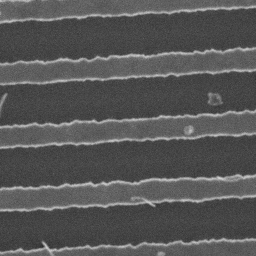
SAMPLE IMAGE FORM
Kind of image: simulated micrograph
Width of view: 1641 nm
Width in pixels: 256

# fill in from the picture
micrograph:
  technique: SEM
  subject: lines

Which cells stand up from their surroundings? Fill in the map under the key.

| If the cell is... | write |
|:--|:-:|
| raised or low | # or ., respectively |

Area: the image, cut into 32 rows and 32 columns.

################################
######################..........
#######.........................
................................
................................
................................
.........................#######
.......##.######################
################################
###################.............
##..............................
................................
................................
................................
.......................#########
........########################
################################
##################..............
................................
................................
................................
................................
..................##############
.###.###########################
################################
#################...............
................................
................................
................................
................................
..................##.###########
################################